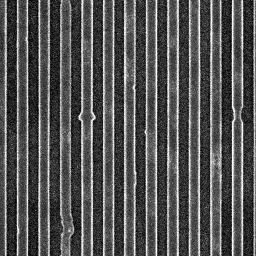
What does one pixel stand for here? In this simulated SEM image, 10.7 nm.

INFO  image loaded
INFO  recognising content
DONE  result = parallel lines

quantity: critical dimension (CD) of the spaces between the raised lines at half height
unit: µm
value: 0.122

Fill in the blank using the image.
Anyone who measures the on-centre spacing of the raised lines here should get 230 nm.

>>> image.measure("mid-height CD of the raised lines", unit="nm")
111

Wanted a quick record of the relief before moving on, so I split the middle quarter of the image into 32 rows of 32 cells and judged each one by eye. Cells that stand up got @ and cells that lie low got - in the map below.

@@---@@---@@---@@@---@@---@@---@
@@---@@---@@---@@@---@@---@@---@
@@---@@---@@---@@@---@@---@@---@
@@---@@---@@---@@@---@@---@@---@
@@---@@---@@---@@@---@@---@@---@
@@---@@---@@---@@@---@@---@@---@
@@---@@---@@---@@@---@@---@@---@
@@---@@---@@---@@@---@@---@@---@
@@---@@---@@---@@@---@@---@@---@
@@---@@---@@---@@@---@@---@@---@
@@---@@---@@---@@@---@@---@@---@
@@---@@---@@---@@@---@@---@@---@
@@--@@@---@@---@@@---@@---@@---@
@@--@@@@--@@---@@@---@@---@@---@
@@---@@---@@---@@@---@@---@@---@
@@---@@---@@---@@@---@@---@@---@
@@---@@---@@---@@----@@---@@---@
@@---@@---@@---@@----@@---@@---@
@@---@@---@@---@@----@@---@@---@
@@---@@---@@---@@----@@---@@---@
@@---@@---@@---@@----@@---@@---@
@@---@@---@@---@@@---@@---@@---@
@@---@@---@@---@@@---@@---@@---@
@@---@@---@@---@@@---@@---@@---@
@@---@@---@@---@@@---@@---@@---@
@@---@@---@@---@@@---@@---@@---@
@@---@@---@@---@@@---@@---@@---@
@@---@@---@@---@@@---@@---@@---@
@@---@@---@@---@@@---@@---@@---@
@@---@@---@@---@@@---@@---@@---@
@@---@@---@@---@@@---@@---@@---@
@@---@@---@@---@@@---@@---@@---@